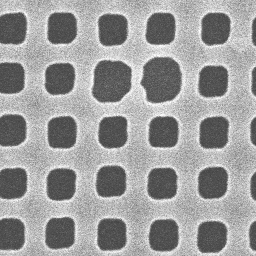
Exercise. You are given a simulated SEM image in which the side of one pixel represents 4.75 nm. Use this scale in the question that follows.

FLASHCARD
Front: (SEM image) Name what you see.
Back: a regular array of holes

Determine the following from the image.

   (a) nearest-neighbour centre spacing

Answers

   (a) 0.239 micrometres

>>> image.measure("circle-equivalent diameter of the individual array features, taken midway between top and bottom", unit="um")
0.157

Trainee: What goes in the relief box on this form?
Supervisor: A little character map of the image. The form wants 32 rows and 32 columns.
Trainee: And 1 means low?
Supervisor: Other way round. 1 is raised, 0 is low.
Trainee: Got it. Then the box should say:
11111111111111111111111111111111
11111110111111111111111111111111
00011100001100001100001110000111
00011100001100001100001110000110
00011100011100001100001110000110
00111110011110011110011111001111
11111111111111111111111111111111
11111111111111111110001111111111
00011100011100001100000110001111
00011100011100001100000110000110
00011100011100001100000110000110
00111100011000001100001110001111
11111111111100011100001111111111
11111111111111111111111111111111
00011111111111111111111111111111
00011100001100001110001110000110
00011100001100001110001110000110
00011100001100001110001110000110
11111110011110011111111111001111
11111111111111111111111111111111
11111111111111111111111111111111
00011100011100001110001110001111
00011100001100001100001110000110
00011100001100001100001110001110
00011100011110011110001110001110
11111111111111111111111111111111
11111111111111111111111111111111
00111100011110011111001111111111
00011100011100001110001110001110
00011100011100001110001110001110
00011100011100001110001110001110
11111111111111111111111110011111